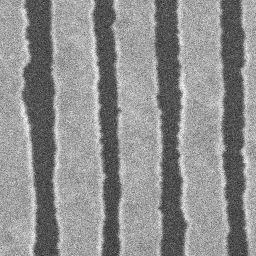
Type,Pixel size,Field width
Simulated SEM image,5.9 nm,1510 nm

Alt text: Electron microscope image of one or a few lines or trenches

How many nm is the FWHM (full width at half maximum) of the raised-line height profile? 233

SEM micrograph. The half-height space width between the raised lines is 23.9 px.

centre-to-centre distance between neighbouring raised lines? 370 nm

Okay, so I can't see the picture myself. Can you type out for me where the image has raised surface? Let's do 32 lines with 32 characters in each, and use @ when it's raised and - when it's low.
@@@----@@@@@--@@@@@----@@@@---@@
@@@----@@@@----@@@@---@@@@@---@@
@@@----@@@@----@@@@---@@@@@---@@
@@@----@@@@---@@@@@---@@@@@@---@
@@@----@@@@@--@@@@@---@@@@@----@
@@@----@@@@@---@@@@----@@@@----@
@@@----@@@@@---@@@@----@@@@----@
@@@----@@@@@---@@@@---@@@@@@---@
@@@----@@@@@---@@@@----@@@@@---@
@@@----@@@@@---@@@@----@@@@@--@@
@@@----@@@@@---@@@@@---@@@@@---@
@@@----@@@@@---@@@@@---@@@@@---@
@@@----@@@@@---@@@@----@@@@@---@
@@@----@@@@@---@@@@@---@@@@@---@
@@@----@@@@@---@@@@@---@@@@@---@
@@@----@@@@@---@@@@@---@@@@@---@
@@@----@@@@@---@@@@@---@@@@@---@
@@@@---@@@@@---@@@@@---@@@@@---@
@@@@---@@@@@---@@@@@--@@@@@@---@
@@@@---@@@@@@--@@@@@---@@@@@---@
@@@@---@@@@@@--@@@@@---@@@@@---@
@@@@---@@@@@@--@@@@@---@@@@@---@
@@@@---@@@@@@--@@@@@---@@@@@---@
@@@@---@@@@@@--@@@@@---@@@@@---@
@@@@---@@@@@@--@@@@@---@@@@@---@
@@@@---@@@@@@--@@@@@---@@@@@---@
@@@@---@@@@@@--@@@@@---@@@@@---@
@@@@---@@@@@@--@@@@@----@@@@---@
@@@@----@@@@@--@@@@@----@@@@---@
@@@@----@@@@@--@@@@@---@@@@@---@
@@@@----@@@@@--@@@@@---@@@@@---@
@@@@----@@@@---@@@@@---@@@@@---@